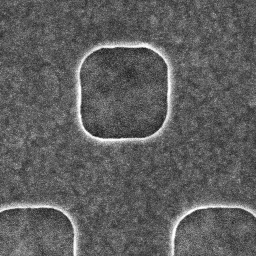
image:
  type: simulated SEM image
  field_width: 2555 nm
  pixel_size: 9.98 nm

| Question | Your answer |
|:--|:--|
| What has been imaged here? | holes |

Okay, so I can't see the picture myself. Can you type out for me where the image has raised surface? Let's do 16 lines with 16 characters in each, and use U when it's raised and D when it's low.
UUUUUUUUUUUUUUUU
UUUUUUUUUUUUUUUU
UUUUUUUUUUUUUUUU
UUUUUUDDDDUUUUUU
UUUUUDDDDDDUUUUU
UUUUUDDDDDDUUUUU
UUUUUDDDDDUUUUUU
UUUUUDDDDDUUUUUU
UUUUUUDDDUUUUUUU
UUUUUUUUUUUUUUUU
UUUUUUUUUUUUUUUU
UUUUUUUUUUUUUUUU
UUUUUUUUUUUUUUUU
DDDDUUUUUUUUDDDD
DDDDDUUUUUUDDDDD
DDDDDUUUUUUDDDDD